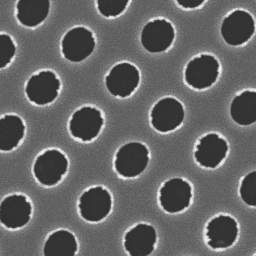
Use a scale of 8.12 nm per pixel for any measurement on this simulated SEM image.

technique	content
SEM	a regular array of holes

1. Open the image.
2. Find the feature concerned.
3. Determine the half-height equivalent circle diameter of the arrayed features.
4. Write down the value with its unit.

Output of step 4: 268 nanometres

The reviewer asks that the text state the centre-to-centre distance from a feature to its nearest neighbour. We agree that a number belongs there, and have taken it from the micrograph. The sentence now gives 457 nm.